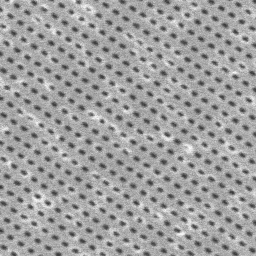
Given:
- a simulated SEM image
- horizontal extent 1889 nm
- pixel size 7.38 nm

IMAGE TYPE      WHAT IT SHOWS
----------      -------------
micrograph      a regular array of holes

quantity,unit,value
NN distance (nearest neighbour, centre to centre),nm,89